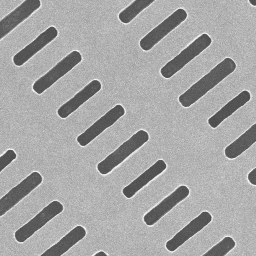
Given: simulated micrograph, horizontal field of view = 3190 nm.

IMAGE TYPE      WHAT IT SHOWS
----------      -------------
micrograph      a regular array of holes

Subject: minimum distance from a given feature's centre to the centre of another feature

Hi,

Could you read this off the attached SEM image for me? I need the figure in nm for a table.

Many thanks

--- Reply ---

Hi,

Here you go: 425